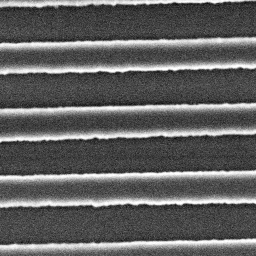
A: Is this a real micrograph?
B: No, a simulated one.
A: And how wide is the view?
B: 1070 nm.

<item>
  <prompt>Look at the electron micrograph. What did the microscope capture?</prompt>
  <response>lines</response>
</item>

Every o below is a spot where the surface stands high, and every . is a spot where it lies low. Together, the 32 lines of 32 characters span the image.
ooooooo.oo......................
................................
................................
................................
................................
..oooooooooooooooooooooooooooooo
oooooooooooooooooooooooooooooooo
oooooooooooooooooooooooooooooooo
ooooooooooooooooooooooo.o.......
................................
................................
................................
................................
........oooooooooooooooooooooooo
oooooooooooooooooooooooooooooooo
oooooooooooooooooooooooooooooooo
oooooooooooooooooooooooooooooooo
oo.oo...........................
................................
................................
................................
...............................o
oooooooooooooooooooooooooooooooo
oooooooooooooooooooooooooooooooo
oooooooooooooooooooooooooooooooo
oooooooooooooo..................
................................
................................
................................
................................
...............ooooooooooooooooo
oooooooooooooooooooooooooooooooo